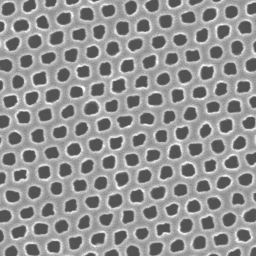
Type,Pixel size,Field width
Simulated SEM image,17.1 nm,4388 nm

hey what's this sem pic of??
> a regular array of holes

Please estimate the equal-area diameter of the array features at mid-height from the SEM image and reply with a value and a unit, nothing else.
13.1 pixels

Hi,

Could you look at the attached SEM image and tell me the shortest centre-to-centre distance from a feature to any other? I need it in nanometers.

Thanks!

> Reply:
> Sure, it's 357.